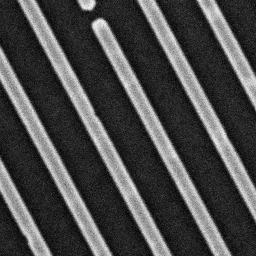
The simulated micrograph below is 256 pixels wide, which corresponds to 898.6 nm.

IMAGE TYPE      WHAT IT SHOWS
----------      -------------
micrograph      parallel lines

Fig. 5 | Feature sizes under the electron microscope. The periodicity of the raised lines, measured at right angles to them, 185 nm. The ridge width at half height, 53.4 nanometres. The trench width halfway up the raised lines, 132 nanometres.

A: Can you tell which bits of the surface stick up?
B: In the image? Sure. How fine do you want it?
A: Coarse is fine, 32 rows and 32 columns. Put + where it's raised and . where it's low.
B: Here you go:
...++.....++.....+++.....++.....
...++.............++.....+++....
....++......+......++.....++....
....++......++.....++......++...
.....++.....++......++.....++...
.....++......++.....++......++..
......++.....++......++.....++..
+.....++......++.....++......++.
+......++.....++......++.....++.
++.....++......++.....++......++
++......++.....++......++.....++
.++.....++......++.....++......+
.+++.....++.....+++.....++.....+
..++......++.....++.....+++.....
..+++.....++......++.....++.....
...++......++.....++......++....
....++.....++......++.....++....
....++......++.....++......++...
.....++.....++......++.....++...
.....++......++.....++......++..
......++.....++......++.....++..
+.....++......++.....++......++.
+......++.....++......++.....++.
++.....++......++.....++......++
++......++.....++......++.....++
.++.....++......++.....++......+
.+++.....++.....+++.....++.....+
..++......++.....++.....+++.....
...++.....++.....+++.....++.....
...++......++.....++.....+++....
....++.....++......++.....++....
....++......++.....++......++...